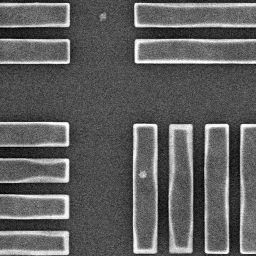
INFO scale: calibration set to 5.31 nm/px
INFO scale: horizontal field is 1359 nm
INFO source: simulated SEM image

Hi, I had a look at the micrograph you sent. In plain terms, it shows groups of lines, slits or small figures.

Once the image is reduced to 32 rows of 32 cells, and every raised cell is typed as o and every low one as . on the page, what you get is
.................o..............
ooooooooo........ooooooooooooooo
ooooooooo........ooooooooooooooo
................................
................................
ooooooooo........ooooooooooooooo
ooooooooo........ooooooooooooooo
ooooooooo........ooooooooooooooo
................................
................................
................................
................................
................................
................................
................................
oooooooo........................
oooooooo.........ooo.ooo..oo..oo
oooooooo.........ooo.ooo..oo..oo
.................ooo.ooo..oo..oo
.................oo..ooo..oo..oo
oooooooo.........oo..ooo..oo..oo
oooooooo.........oo..ooo..oo..oo
oooo...o.........ooo.ooo..oo..oo
.................ooo.ooo..oo..oo
oooo.............ooo.ooo..oo..oo
oooooooo.........ooo.ooo..oo..oo
oooooooo.........ooo.ooo..oo..oo
.................ooo.ooo..oo..oo
.................ooo.ooo..oo..oo
oooooooo.........oo..ooo..ooo.oo
oooooooo.........oo..ooo..ooo.oo
o.oooooo..................oo..oo